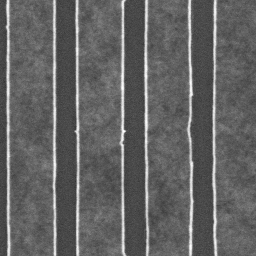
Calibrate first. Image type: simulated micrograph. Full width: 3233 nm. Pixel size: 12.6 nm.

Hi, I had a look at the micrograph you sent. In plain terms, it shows one or a few lines or trenches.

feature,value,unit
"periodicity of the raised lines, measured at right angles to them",866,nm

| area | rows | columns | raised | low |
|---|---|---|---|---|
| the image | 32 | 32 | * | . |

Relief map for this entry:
.******...*****...******...*****
.******...*****...******...*****
.******...*****...******...*****
.******...*****...******...*****
.******...*****...******...*****
.******...*****...******...*****
.******...*****...******...*****
.******...*****...******...*****
.******...*****...******...*****
.******...*****...******...*****
.******...*****...******...*****
.******...*****...******...*****
.******...*****...******...*****
.******...*****...******...*****
.******...*****...******...*****
.******...*****...******...*****
.******...*****...******...*****
.******...*****...******...*****
.******...*****...******...*****
.******...*****...******...*****
.******...*****...******...*****
.******...*****...******...*****
.******...*****...******...*****
.******...*****...******...*****
.******...*****...******...*****
.******...*****...******...*****
.******...*****...******...*****
.******...*****...******...*****
.******...*****...******...*****
.******...*****...******...*****
.******...*****...******...*****
.******...*****...******...*****